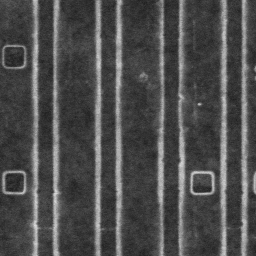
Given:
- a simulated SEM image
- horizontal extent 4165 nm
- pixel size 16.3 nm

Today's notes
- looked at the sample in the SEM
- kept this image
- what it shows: wiring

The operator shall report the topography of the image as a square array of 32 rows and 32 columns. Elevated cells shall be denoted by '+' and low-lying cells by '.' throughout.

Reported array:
++++...+++++...+++++...+++++...+
++++...+++++...+++++...+++++...+
++++...+++++...+++++...+++++...+
++++...+++++...+++++...+++++...+
++++...+++++...+++++...+++++...+
++++...+++++...+++++...+++++...+
...+...+++++...+++++...+++++...+
...+...+++++...+++++...+++++...+
++++...+++++...+++++...+++++...+
++++...+++++...+++++...+++++...+
++++...+++++...+++++...+++++...+
++++...+++++...+++++...+++++...+
++++...+++++...+++++...+++++...+
++++...+++++...+++++...+++++...+
++++...+++++...+++++...+++++...+
++++...+++++...+++++...+++++...+
++++...+++++...+++++...+++++...+
++++...+++++...+++++...+++++...+
++++...+++++...+++++...+++++...+
++++...+++++...+++++...+++++...+
++++...+++++...+++++...+++++...+
++++...+++++...+++++...+++++...+
+..+...+++++...+++++...+...+...+
+..+...+++++...+++++...+..++...+
++++...+++++...+++++...+++++...+
++++...+++++...+++++...+++++...+
++++...+++++...+++++...+++++...+
++++...+++++...+++++...+++++...+
++++...+++++...+++++...+++++...+
++++...+++++...+++++...+++++...+
++++...+++++...+++++...+++++...+
++++...+++++...+++++...+++++...+